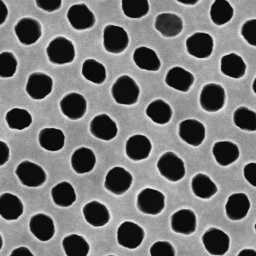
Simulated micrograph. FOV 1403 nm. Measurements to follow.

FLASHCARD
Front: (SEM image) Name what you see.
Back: a regular array of holes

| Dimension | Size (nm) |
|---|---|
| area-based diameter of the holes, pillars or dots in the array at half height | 134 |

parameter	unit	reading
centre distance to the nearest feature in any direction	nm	210